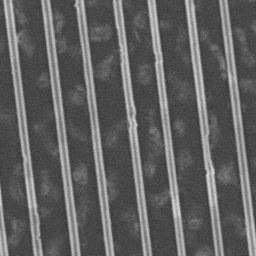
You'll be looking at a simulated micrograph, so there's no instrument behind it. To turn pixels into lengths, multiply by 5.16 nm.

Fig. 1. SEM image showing parallel lines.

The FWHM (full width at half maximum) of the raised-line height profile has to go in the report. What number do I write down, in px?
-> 6.07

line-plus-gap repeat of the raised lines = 184 nm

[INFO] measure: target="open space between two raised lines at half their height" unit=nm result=152